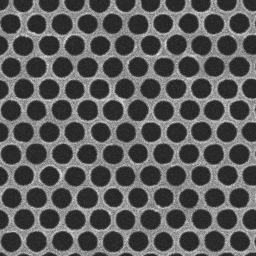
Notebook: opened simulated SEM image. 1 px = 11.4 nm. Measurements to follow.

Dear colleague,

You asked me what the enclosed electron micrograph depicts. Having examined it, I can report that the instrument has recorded a regular array of holes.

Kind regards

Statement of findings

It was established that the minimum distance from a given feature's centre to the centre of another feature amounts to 282 nm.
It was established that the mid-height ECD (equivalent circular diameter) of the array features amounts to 232 nanometres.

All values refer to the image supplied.